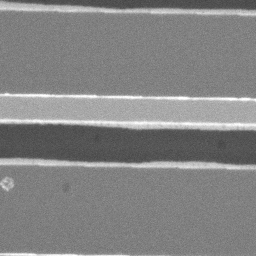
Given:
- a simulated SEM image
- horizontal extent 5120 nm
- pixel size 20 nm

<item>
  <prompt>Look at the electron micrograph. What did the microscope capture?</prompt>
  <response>lines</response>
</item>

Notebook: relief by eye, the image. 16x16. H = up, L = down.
LLLLLLLLLLLLLLLL
HHHHHHHHHHHHHHHH
HHHHHHHHHHHHHHHH
HHHHHHHHHHHHHHHH
HHHHHHHHHHHHHHHH
HHHHHHHHHHHHHHHH
HHHHHHHHHHHHHHHH
HHHHHHHHHHHHHHHH
LLLLLLLLLLLLLLLL
LLLLLLLLLLLLLLLL
HHHHHHHHHHHHHHHL
HHHHHHHHHHHHHHHH
HHHHHHHHHHHHHHHH
HHHHHHHHHHHHHHHH
HHHHHHHHHHHHHHHH
HHHHHHHHHHHHHHHH